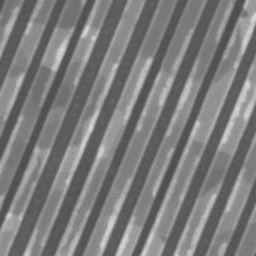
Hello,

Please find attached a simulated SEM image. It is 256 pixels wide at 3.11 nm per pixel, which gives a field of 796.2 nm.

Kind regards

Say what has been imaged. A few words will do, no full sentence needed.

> parallel lines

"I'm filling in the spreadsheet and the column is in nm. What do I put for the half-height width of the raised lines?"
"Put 49.2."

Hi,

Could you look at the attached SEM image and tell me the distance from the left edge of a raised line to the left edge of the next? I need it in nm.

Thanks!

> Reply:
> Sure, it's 87.1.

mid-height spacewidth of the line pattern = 40.6 nanometers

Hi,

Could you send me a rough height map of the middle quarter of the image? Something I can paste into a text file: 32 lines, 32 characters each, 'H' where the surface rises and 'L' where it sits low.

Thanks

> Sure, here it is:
LHHHHLLLLHHHHLLLLLHHHHLLHHHHHLLL
LHHHHLLLLHHHHLLLLHHHHLLLHHHHLLLL
HHHHLLLLLHHHHLLLLHHHHLLLHHHHLLLL
HHHHLLLLHHHHLLLLHHHHLLLHHHHLLLLH
HHHLLLLLHHHHLLLLHHHHLLLHHHHLLLLH
HHHLLLLLHHHLLLLHHHHLLLHHHHHLLLHH
HHHLLLLHHHHLLLLHHHHLLLHHHHLLLLHH
HHLLLLLHHHHLLLLHHHHLLHHHHHLLLLHH
HHLLLLHHHHLLLLHHHHLLLHHHHLLLLHHH
HLLLLLHHHHLLLLHHHHLLLHHHHLLLLHHH
HLLLLHHHHLLLLHHHHLLLHHHHHLLLHHHH
HLLLLHHHHLLLLHHHHLLLHHHHLLLLHHHH
LLLLLHHHLLLLLHHHHLLHHHHHLLLLHHHL
LLLLHHHHLLLLHHHHLLLHHHHLLLLHHHHL
LLLLHHHHLLLLHHHHLLLHHHHLLLLHHHLL
LLLHHHHLLLLHHHHLLLHHHHLLLLHHHHLL
LLLHHHHLLLLHHHHLLLHHHHLLLLHHHHLL
LLHHHHLLLLLHHHHLLHHHHHLLLHHHHLLL
LLHHHHLLLLHHHHLLLHHHHLLLLHHHHLLH
LLHHHHLLLLHHHHLLLHHHHLLLLHHHLLLH
LHHHHLLLLHHHHLLLHHHHLLLLHHHHLLLH
LHHHHLLLLHHHHLLLHHHHLLLLHHHHLLHH
HHHHLLLLHHHHLLLHHHHHLLLHHHHLLLHH
HHHHLLLLHHHHLLLHHHHLLLLHHHHLLHHH
HHHHLLLLHHHHLLHHHHHLLLLHHHLLLHHH
HHHLLLLHHHHLLLHHHHLLLLHHHHLLHHHH
HHHLLLLHHHHLLLHHHHLLLLHHHLLLHHHH
HHLLLLHHHHLLLHHHHLLLLHHHHLLLHHHH
HHLLLLHHHHLLLHHHHLLLLHHHHLLHHHHH
HHLLLLHHHHLLHHHHHLLLLHHHLLLHHHHL
HLLLLHHHHLLLHHHHLLLLHHHHLLHHHHHL
HLLLLHHHHLLLHHHHLLLLHHHLLLHHHHHL